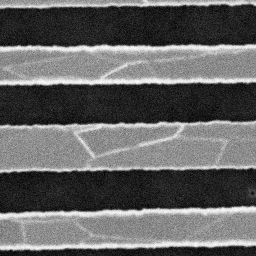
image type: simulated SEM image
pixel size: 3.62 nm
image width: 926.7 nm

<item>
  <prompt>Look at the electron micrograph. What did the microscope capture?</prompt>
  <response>lines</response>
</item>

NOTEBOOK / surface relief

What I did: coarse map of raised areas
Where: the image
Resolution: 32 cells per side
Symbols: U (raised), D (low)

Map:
UUUUUUUUUUUUUUUUUUUUUUUUUUUUUUUU
DDDDDDDDDDDDDDDDDDDDDDDDDDDDDDDD
DDDDDDDDDDDDDDDDDDDDDDDDDDDDDDDD
DDDDDDDDDDDDDDDDDDDDDDDDDDDDDDDD
DDDDDDDDDDDDDDDDDDDDDDDDDDDDDDDD
DDDDDDDDDDDDDDDDDDDDDDDDDDDDDDDD
UUUUUUUUUUUUUUUUUUUUUUUUUUUUUUUU
UUUUUUUUUUUUUUUUUUUUUUUUUUUUUUUU
UUUUUUUUUUUUUUUUUUUUUUUUUUUUUUUU
UUUUUUUUUUUUUUUUUUUUUUUUUUUUUUUU
DUDDDDDDDDDDDDDDDDDDDDDDDDDDDDDD
DDDDDDDDDDDDDDDDDDDDDDDDDDDDDDDD
DDDDDDDDDDDDDDDDDDDDDDDDDDDDDDDD
DDDDDDDDDDDDDDDDDDDDDDDDDDDDDDDD
DDDDDDDDDDDDDDDDDDDDDDDDDDDDDDDD
DDDDDDDDDDDDDDDUDUDUUUUUUUUUUUUU
UUUUUUUUUUUUUUUUUUUUUUUUUUUUUUUU
UUUUUUUUUUUUUUUUUUUUUUUUUUUUUUUU
UUUUUUUUUUUUUUUUUUUUUUUUUUUUUUUU
UUUUUUUUUUUUUUUUUUUUUUUUUUUUUUUU
UUUUUUUUUUUUUUUUUUUUUUUUUUUUUUUU
UDDDDDDDDDDDDDDDDDDDDDDDDDDDDDDD
DDDDDDDDDDDDDDDDDDDDDDDDDDDDDDDD
DDDDDDDDDDDDDDDDDDDDDDDDDDDDDDDD
DDDDDDDDDDDDDDDDDDDDDDDDDDDDDDDD
DDDDDDDDDDDDDDDDDDDDDDDDDDDDDDDD
DDDDDDDDDDDDUUUUUUUUUUUUUUUUUUUU
UUUUUUUUUUUUUUUUUUUUUUUUUUUUUUUU
UUUUUUUUUUUUUUUUUUUUUUUUUUUUUUUU
UUUUUUUUUUUUUUUUUUUUUUUUUUUUUUUU
UUUUUUUUUUUUUUUUUUUUUUUUUUUUUUUU
DDDDDDDDDDDDDDDDDDDDDDDDDDDDDDDD